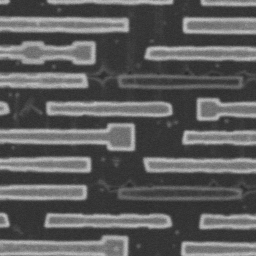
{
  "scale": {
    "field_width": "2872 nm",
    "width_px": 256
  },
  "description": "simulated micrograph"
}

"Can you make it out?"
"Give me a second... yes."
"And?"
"wiring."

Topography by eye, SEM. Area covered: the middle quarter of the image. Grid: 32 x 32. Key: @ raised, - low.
--------------------------------
--------------------------------
--------------------------------
@@@@@---------@@@@@@@@@@@@@@@@@@
@@@@@---------@@@@@@@@@@@@@@@@@@
@@@@@---------@@@@@@@@@@@@@@@@@@
--------------------------------
--------------------------------
--------------------------------
--------------------------------
@@@@@@@@@@@@@@@@@@@@@@@@@@------
@@@@@@@@@@@@@@@@@@@@@@@@@@@-----
-@@@@--@@@@@--@@@@@@@@@@@@------
--------------------------------
--------------------------------
-----------@@@@@@---------------
-----------@@@@@@---------------
@@@@@@@@@@@@@@@@@-------------@@
@@@@@@@@@@@@@@@@@-------------@@
@@@@@@@@@@@@@@@@@-------------@@
-----------@@@@@@---------------
--------------------------------
--------------------------------
--------------------------------
@@@@@@--------------@@@@@@@@@@@@
@@@@@@---------------@@@@@@@@@@@
@@@@@@---------------@@@@@@@@@@@
--------------------------------
--------------------------------
--------------------------------
--------------------------------
@@@@@---------@@@@@@@@@@@@@@@@@@